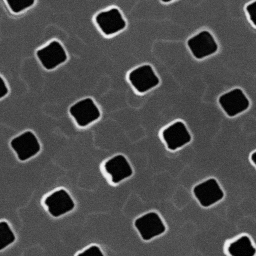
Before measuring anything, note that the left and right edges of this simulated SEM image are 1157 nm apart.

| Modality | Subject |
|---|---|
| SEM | a regular array of holes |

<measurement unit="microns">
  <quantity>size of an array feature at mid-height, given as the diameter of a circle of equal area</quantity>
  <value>0.122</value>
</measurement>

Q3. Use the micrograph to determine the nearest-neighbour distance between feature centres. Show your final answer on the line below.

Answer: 295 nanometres